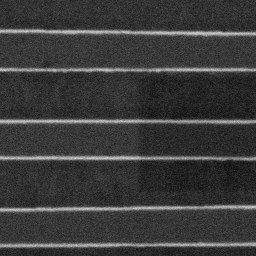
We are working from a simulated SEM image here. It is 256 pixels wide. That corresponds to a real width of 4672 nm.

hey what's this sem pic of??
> lines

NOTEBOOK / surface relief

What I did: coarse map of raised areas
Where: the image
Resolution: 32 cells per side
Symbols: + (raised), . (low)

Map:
................................
................................
................................
................................
++++++++++++++++++++++++++++++++
++++++++++++++++++++++++++++++++
++++++++++++++++++++++++++++++++
++++++++++++++++++++++++++++++++
++++++++++++++++++++++++++++++++
................................
................................
................................
................................
................................
................................
++++++++++++++++++++++++++++++++
++++++++++++++++++++++++++++++++
++++++++++++++++++++++++++++++++
++++++++++++++++++++++++++++++++
++++++++++++++++++++++++++++++++
................................
................................
................................
................................
................................
................................
++++++++++++++++++++++++++++++++
++++++++++++++++++++++++++++++++
++++++++++++++++++++++++++++++++
++++++++++++++++++++++++++++++++
++++++++++++++++++++++++++++++++
................................